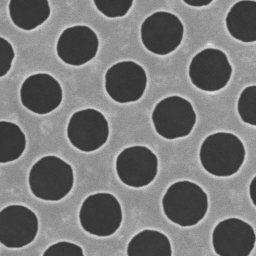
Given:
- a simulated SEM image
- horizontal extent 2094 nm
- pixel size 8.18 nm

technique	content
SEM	a regular array of holes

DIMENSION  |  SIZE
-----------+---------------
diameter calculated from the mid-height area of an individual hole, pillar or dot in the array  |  348 nanometers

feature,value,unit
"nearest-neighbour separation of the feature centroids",493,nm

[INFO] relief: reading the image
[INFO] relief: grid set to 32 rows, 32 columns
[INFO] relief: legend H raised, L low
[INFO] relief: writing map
HLLLLLHHHHHHLLLLHHHHHHHLLLHHHLLL
HLLLLLHHHHHHHLLLHHHHLHHHHHHHHLLL
HHLLLLHHHHHHHHHHHHLLLLHHHHHHLLLL
HHHLHHHHHLLHHHHHHHLLLLLHHHHHLLLL
HHHHHHHHLLLLHHHHHHLLLLLHHHHHHLLL
LHHHHHHLLLLLHHHHHHLLLLHHHHHHHHHH
LLHHHHHLLLLLHHHHHHHLLHHHHLLLHHHH
LLHHHHHHLLLHHHHHHHHHHHHHLLLLHHHH
LHHHHHHHHHHHHHLLLLHHHHHHLLLLLHHH
HHHHLLHHHHHHHLLLLLHHHHHHLLLLLHHH
HHHLLLLHHHHHHLLLLLHHHHHHLLLLHHHH
HHHLLLLLHHHHHLLLLLHHHHHHHHHHHHLL
HHHLLLLLHHHHHHLLLHHHLLLHHHHHHHLL
HHHLLLLHHHHHHHHHHHHLLLLLHHHHHHLL
HHHHHHHHHLLLLHHHHHHLLLLLHHHHHHLL
LLHHHHHHHLLLLHHHHHHLLLLLHHHHHHHL
LLLHHHHHLLLLLLHHHHHHLLLLHHHHHHHH
LLLHHHHHHLLLLHHHHHHHHHHHHHLLLLHH
LLLHHHHHHHLLHHHHLLHHHHHHHLLLLLHH
LLHHHHLHHHHHHHHLLLLHHHHHHLLLLLLH
HHHHLLLLHHHHHHHLLLLLHHHHHLLLLLHH
HHHHLLLLLHHHHHHLLLLLHHHHHHLLLHHH
HHHHLLLLLHHHHHHLLLLHHHHHHHHHHHHH
HHHHLLLLLHHHHHHHHHHHHLLLLHHHHHHL
HHHHHLLLHHHLLLHHHHHHLLLLLLHHHHHL
HHHHHHHHHHLLLLLHHHHHLLLLLLHHHHHH
LLLLHHHHHHLLLLLHHHHHHLLLLLHHHHHH
LLLLLHHHHHLLLLLHHHHHHLLLLHHHLLHH
LLLLLHHHHHLLLLLHHHHHHHHHHHHLLLLL
LLLLHHHHHHHHLHHHHLLLLHHHHHHLLLLL
LLLHHHHLLHHHHHHHLLLLLHHHHHHLLLLL
HHHHHHLLLLHHHHHHLLLLLHHHHHHLLLLH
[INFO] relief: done